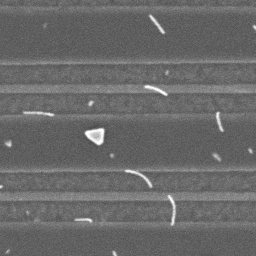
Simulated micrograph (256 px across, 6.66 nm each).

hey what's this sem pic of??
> lines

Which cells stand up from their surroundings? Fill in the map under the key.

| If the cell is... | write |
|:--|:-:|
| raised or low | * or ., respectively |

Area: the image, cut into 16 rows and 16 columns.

****************
****************
****************
****************
................
................
................
****************
****************
****************
****************
................
..........*.....
................
****************
****************